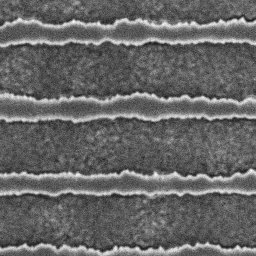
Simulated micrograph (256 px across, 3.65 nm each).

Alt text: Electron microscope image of lines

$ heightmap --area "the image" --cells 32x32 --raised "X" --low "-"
--------------------------------
--------------------------------
--X------------X-X-----------XX-
XXXXXXXXXXXXXXXXXXXXXXXXXXXXXXXX
XXXXXXXXXXXXXXXXXXXXXXXXXXXXXXXX
XX----XX--------XX---X---------X
--------------------------------
--------------------------------
--------------------------------
--------------------------------
--------------------------------
--------------------------------
XXXXXXXXXXXX-XXXXXXXXXXXXXXXX--X
XXXXXXXXXXXXXXXXXXXXXXXXXXXXXXXX
XXXXXXXXXXXXXXXXXXXXXXXXXXXXXXXX
--------------------------------
--------------------------------
--------------------------------
--------------------------------
--------------------------------
--------------------------------
---------------X---------------X
XXXXXXXXXXXXXXXXXXXXXXXXXXXXXXXX
XXXXXXXXXXXXXXXXXXXXXXXXXXXXXXXX
--------------------------------
--------------------------------
--------------------------------
--------------------------------
--------------------------------
--------------------------------
--------------------------------
XXXXXXXXXXXXXXXXXXXXXXXXXXXXXXXX